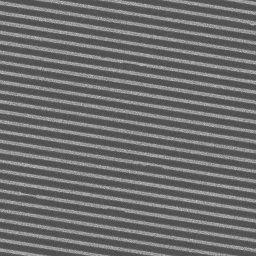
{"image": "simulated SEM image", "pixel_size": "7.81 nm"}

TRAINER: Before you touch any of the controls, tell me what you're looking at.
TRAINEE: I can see parallel lines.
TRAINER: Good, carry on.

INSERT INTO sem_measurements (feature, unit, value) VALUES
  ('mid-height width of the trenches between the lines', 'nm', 44.4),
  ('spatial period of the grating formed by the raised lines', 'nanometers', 76.3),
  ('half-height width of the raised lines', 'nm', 28.9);